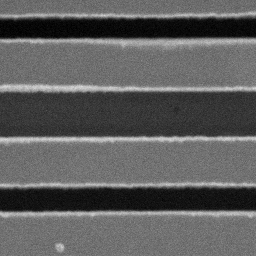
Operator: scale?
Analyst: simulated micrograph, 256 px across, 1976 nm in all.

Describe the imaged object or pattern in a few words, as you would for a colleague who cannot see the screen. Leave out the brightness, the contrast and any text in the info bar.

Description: lines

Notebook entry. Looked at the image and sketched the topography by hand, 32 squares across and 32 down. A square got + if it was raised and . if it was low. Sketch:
++++++++++++++++++++++++++++++++
++++++++++++++++++++++++++++++++
................................
................................
................................
++++++++++++++++++++++++++++++++
++++++++++++++++++++++++++++++++
++++++++++++++++++++++++++++++++
++++++++++++++++++++++++++++++++
++++++++++++++++++++++++++++++++
++++++++++++++++++++++++++++++++
................................
................................
................................
................................
................................
................................
++++++++++++++++++++++++++++++++
++++++++++++++++++++++++++++++++
++++++++++++++++++++++++++++++++
++++++++++++++++++++++++++++++++
++++++++++++++++++++++++++++++++
++++++++++++++++++++++++++++++++
................................
................................
................................
........++..++++++++++++++++++++
++++++++++++++++++++++++++++++++
++++++++++++++++++++++++++++++++
++++++++++++++++++++++++++++++++
++++++++++++++++++++++++++++++++
++++++++++++++++++++++++++++++++